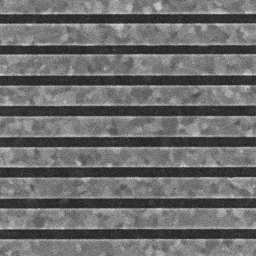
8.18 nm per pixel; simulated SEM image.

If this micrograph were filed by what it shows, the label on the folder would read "parallel lines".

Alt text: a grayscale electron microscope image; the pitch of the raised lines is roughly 251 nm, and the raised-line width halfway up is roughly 0.168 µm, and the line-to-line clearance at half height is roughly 83.8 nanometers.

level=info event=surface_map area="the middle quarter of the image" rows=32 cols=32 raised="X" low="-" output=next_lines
XXXXXXXXXXXXXXXXXXXXXXXXXXXXXXXX
XXXXXXXXXXXXXXXXXXXXXXXXXXXXXXXX
XXXXXXXXXXXXXXXXXXXXXXXXXXXXXXXX
--------------------XX----------
--------------------------------
--------------------------------
XXXXXXXXXXXXXXXXXXXXXXXXXXXXXXXX
XXXXXXXXXXXXXXXXXXXXXXXXXXXXXXXX
XXXXXXXXXXXXXXXXXXXXXXXXXXXXXXXX
XXXXXXXXXXXXXXXXXXXXXXXXXXXXXXXX
--------------------------------
--------------------------------
--------------------------------
XXXXXXXXXXXXXXXXXXXXXXXXXXXXXXXX
XXXXXXXXXXXXXXXXXXXXXXXXXXXXXXXX
XXXXXXXXXXXXXXXXXXXXXXXXXXXXXXXX
XXXXXXXXXXXXXXXXXXXXXXXXXXXXXXXX
XXXXXXXXXXXXXXXXXXXXXXXXXXXXXXXX
--------------------------------
--------------------------------
--------------------------------
XXXXXXXXXXXXXXXXXXXXXXXXXXXXXXXX
XXXXXXXXXXXXXXXXXXXXXXXXXXXXXXXX
XXXXXXXXXXXXXXXXXXXXXXXXXXXXXXXX
XXXXXXXXXXXXXXXXXXXXXXXXXXXXXXXX
XXXXXXXXXXXXXXXXXXXXXXXXXXXXXXXX
--------------------------------
---X----------------------------
-----XX-XXXX-XXXXXX-----XXXX----
XXXXXXXXXXXXXXXXXXXXXXXXXXXXXXXX
XXXXXXXXXXXXXXXXXXXXXXXXXXXXXXXX
XXXXXXXXXXXXXXXXXXXXXXXXXXXXXXXX